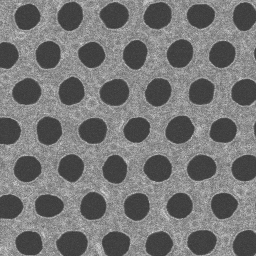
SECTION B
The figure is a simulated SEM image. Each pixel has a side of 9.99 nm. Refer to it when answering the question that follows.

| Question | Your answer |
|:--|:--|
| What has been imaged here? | a regular array of holes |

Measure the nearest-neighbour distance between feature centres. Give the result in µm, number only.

0.429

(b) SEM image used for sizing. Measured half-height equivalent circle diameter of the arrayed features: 266 nm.